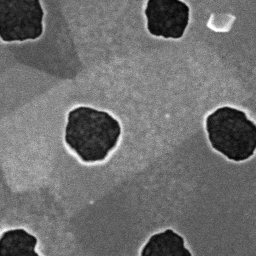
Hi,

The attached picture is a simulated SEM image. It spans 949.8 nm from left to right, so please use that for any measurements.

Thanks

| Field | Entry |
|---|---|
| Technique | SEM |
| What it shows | holes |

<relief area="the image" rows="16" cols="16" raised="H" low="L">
LLLHHHHHHLLLHHHH
LLLHHHHHHLLLHHHH
LHHHHHHHHHHHHHHH
HHHHHHHHHHHHHHHH
HHHHHHHHHHHHHHHH
HHHHHHHHHHHHHHHH
HHHHHHHHHHHHHHHH
HHHHLLLHHHHHHLLL
HHHHLLLHHHHHHLLL
HHHHHLLHHHHHHHLL
HHHHHHHHHHHHHHHH
HHHHHHHHHHHHHHHH
HHHHHHHHHHHHHHHH
HHHHHHHHHHHHHHHH
LLHHHHHHHHLHHHHH
LLHHHHHHHLLLHHHH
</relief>